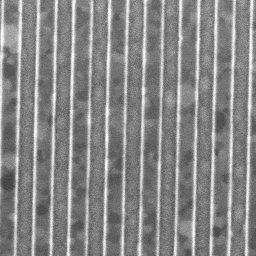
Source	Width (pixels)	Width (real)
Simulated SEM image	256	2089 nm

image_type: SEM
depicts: parallel lines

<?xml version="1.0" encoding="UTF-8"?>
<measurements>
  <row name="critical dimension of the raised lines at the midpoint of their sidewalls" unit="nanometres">150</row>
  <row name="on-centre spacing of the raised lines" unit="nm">290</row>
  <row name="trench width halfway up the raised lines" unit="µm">0.143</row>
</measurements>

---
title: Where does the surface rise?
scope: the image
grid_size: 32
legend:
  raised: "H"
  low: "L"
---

HHHLLHHLLHHHLLHHLLHHLLLHHLLHHLLL
HHHLLHHLLHHHLLHHLLHHLLLHHLLHHLLL
HHLLLHHLLHHLLLHHLLHHLLLHHLLHHLLH
HHLLLHHLLHHLLLHHLLHHLLLHHLLHHLLH
HHLLLHHLLHHLLLHHLLHHLLHHHLLHHLLH
HHLLLHHLLHHLLLHHLLHHLLHHHLLHHLLH
HHLLLHHLLHHLLLHHLLHHLLHHHLLHHLLH
HHLLLHHLLHHLLLHHLLHHLLHHHLLHHLLH
HHLLLHHLLHHLLLHHLLHHLLHHHLLHHLLH
HHLLLHHLLHHLLLHHLLHHLLHHHLLHHLLH
HHLLLHHLLHHLLHHHLLHHLLHHHLLHHLLH
HHLLLHHLLHHLLHHHLLHHLLHHHLLHHLLH
HHLLLHHLLHHLLHHHLLHHLLHHHLLHHLLH
HHLLLHHLLHHLLHHHLLHHLLHHLLLHHLLH
HHLLLHHLLHHLLHHHLLHHLLHHLLLHHLLH
HHLLLHHLLHHLLHHHLLHHLLHHLLLHHLLH
HHLLHHHLLHHLLHHHLLHHLLHHLLLHHLLH
HHLLHHHLLHHLLHHHLLHHLLHHLLLHHLLH
HHLLHHHLLHHLLHHHLLHHLLHHLLLHHLLH
HHLLHHHLLHHLLHHLLLHHLLHHLLLHHLLH
HHLLHHHLLHHLLHHLLLHHLLHHLLLHHLLH
HHLLHHHLLHHLLHHLLLHHLLHHLLLHHLLH
HHLLHHHLLHHLLHHLLLHHLLHHLLLHHLLH
HHLLHHHLLHHLLHHLLLHHLLHHLLLHHLLH
HHLLHHHLLHHLLHHLLLHHLLHHLLLHHLLH
HHLLHHLLLHHLLHHLLLHHLLHHLLLHHLLH
HHLLHHLLLHHLLHHLLLHHLLHHLLHHHLLH
HHLLHHLLLHHLLHHLLLHHLLHHLLHHHLLH
HHLLHHLLLHHLLHHLLLHHLLHHLLHHHLLH
HHLLHHLLLHHLLHHLLLHHLLHHLLHHHLLH
HHLLHHLLLHHLLHHLLLHHLLHHLLHHHLLH
HHLLHHLLLHHLLHHLLLHHLLHHLLHHHLLH